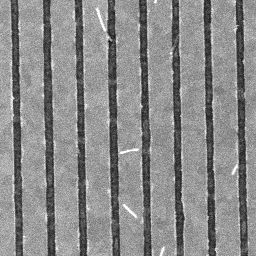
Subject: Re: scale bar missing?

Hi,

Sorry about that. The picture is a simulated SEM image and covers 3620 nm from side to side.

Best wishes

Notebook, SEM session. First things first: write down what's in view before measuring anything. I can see parallel lines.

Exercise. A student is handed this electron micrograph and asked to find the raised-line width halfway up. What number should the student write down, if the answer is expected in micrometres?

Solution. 0.336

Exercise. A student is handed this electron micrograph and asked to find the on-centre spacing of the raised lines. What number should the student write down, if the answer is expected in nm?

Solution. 454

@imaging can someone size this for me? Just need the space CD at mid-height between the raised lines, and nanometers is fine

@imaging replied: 108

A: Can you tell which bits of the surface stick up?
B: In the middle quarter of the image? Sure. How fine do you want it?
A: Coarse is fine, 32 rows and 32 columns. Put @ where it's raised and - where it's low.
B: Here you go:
@@@--@@@@@@--@@@@@@--@@@@@@--@@@
@@@--@@@@@@--@@@@@@--@@@@@@--@@@
@@@--@@@@@@--@@@@@@--@@@@@@--@@@
@@@--@@@@@@--@@@@@@--@@@@@@--@@@
@@@--@@@@@@--@@@@@@--@@@@@@--@@@
@@@--@@@@@@--@@@@@@--@@@@@@--@@@
@@@--@@@@@@--@@@@@@--@@@@@@--@@@
@@@--@@@@@@--@@@@@@--@@@@@@--@@@
@@@--@@@@@@--@@@@@@--@@@@@@--@@@
@@@--@@@@@@--@@@@@@--@@@@@@--@@@
@@@--@@@@@@--@@@@@@--@@@@@@--@@@
@@@--@@@@@@--@@@@@@---@@@@@--@@@
@@@--@@@@@@--@@@@@@---@@@@@--@@@
@@@--@@@@@@--@@@@@@---@@@@@--@@@
@@@--@@@@@@---@@@@@---@@@@@--@@@
@@@--@@@@@@---@@@@@---@@@@@--@@@
@@@--@@@@@@---@@@@@---@@@@@--@@@
@@@--@@@@@@---@@@@@---@@@@@--@@@
@@@--@@@@@@---@@@@@---@@@@@--@@@
@@@---@@@@@---@@@@@---@@@@@---@@
@@@--@@@@@@---@@@@@---@@@@@---@@
@@@@-@@@@@@---@@@@@---@@@@@---@@
@@@--@@@@@@---@@@@@---@@@@@--@@@
@@@--@@@@@@---@@@@@---@@@@@--@@@
@@@--@@@@@@---@@@@@---@@@@@---@@
@@@--@@@@@@---@@@@@---@@@@@---@@
@@@--@@@@@@---@@@@@---@@@@@---@@
@@@--@@@@@@---@@@@@---@@@@@@--@@
@@@@--@@@@@---@@@@@---@@@@@@--@@
@@@---@@@@@---@@@@@@--@@@@@@--@@
@@@---@@@@@---@@@@@@--@@@@@@--@@
@@@---@@@@@---@@@@@@--@@@@@@-@@@